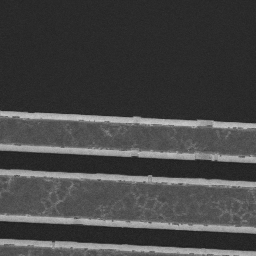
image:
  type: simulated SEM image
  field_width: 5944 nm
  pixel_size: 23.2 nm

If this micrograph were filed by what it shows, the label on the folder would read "one or a few lines or trenches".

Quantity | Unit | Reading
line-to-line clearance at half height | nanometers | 588